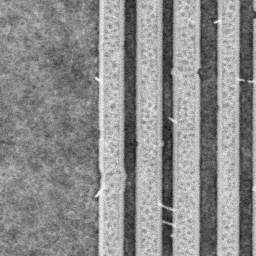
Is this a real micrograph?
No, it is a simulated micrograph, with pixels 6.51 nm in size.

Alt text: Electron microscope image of parallel lines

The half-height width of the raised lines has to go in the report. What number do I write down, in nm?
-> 138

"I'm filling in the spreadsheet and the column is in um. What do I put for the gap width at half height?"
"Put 0.107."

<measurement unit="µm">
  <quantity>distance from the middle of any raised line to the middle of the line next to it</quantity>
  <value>0.253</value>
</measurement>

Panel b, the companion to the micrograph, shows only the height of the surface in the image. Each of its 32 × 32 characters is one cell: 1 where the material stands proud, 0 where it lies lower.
00000000000001100111001110001100
00000000000001100111001110001100
00000000000001100111001110011100
00000000000001100111001110001100
00000000000001100111001110001100
00000000000001100111001110001100
00000000000001100111001110001100
00000000000001100111001110001100
00000000000001100111001110001100
00000000000001100111001110001100
00000000000001100111001110001100
00000000000001100111001110001100
00000000000001100111001110001100
00000000000001100111001110001100
00000000000001100111001110011100
00000000000001100111001110011100
00000000000001100111001110011100
00000000000001100111001110011100
00000000000001100111001110011100
00000000000001100111001110011100
00000000000001100111001110011100
00000000000001100111001110011100
00000000000001100111001110011100
00000000000001100111001110011100
00000000000001100111001110011100
00000000000001100111001110011100
00000000000001100111001110011000
00000000000001100111001110011000
00000000000001100111001110011000
00000000000001100111001110011000
00000000000001100111001110011000
00000000000001100111001110011000